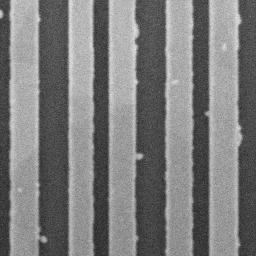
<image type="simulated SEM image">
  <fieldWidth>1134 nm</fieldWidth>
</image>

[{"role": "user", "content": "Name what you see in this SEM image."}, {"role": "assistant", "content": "lines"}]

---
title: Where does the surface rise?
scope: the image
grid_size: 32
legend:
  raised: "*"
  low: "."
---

.****....***..***....***..****..
.****....***..***....***..****..
.****....***..***....***..****..
.****....***..***....***..****..
.****....***..***....***..****..
.****....***..***....***..****..
.****....***..***....***..****..
.****....***..***....***..****..
.****....***..***....***..****..
.****....***..***....***..****..
.****....***..***....***..****..
.****....***..***....***..****..
.****....***..***....***..****..
.****....***..***....***..****..
.****....***..***....***..****..
.****....***..***....***..****..
.****....***..***....***..****..
.****....***..***....***..****..
.****....***..***....***..****..
.****....***..***....***..****..
.****....***..***....***..****..
.****....***..***....***..****..
.****....***..***....***..****..
.****....***..***....***..****..
.****....***..***....***..****..
.****....***..***....***..****..
.****....***..***....***..****..
.****....***..***....***..****..
.****....***..***....***..****..
.****....***..***....***..****..
.****....***..***....***..****..
.****....***..***....***..****..